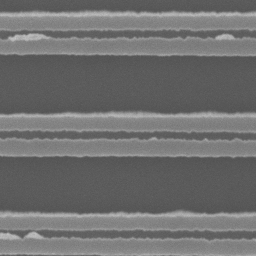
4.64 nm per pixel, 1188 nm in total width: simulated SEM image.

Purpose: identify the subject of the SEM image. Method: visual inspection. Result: lines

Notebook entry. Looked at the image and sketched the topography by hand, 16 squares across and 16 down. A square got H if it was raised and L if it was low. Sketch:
LLLLLLLLLLLLLLLL
HHHHHHHHHHHHHHHH
HHHHHHHHHHHHHHHH
LLLLLLLLLLLLLLLL
LLLLLLLLLLLLLLLL
LLLLLLLLLLLLLLLL
LLLLLLLLLLLLLLLL
HHHHHHHHHHHHHHHH
HHHHHHHHHHHHHHHH
HHHHHHHHHHHHHHHH
LLLLLLLLLLLLLLLL
LLLLLLLLLLLLLLLL
LLLLLLLLLLLLLLLL
HHHHHHHHHHHHHHHH
HHHHHHHHHHHHHHHH
HHHHHHHHHHHHHHHH